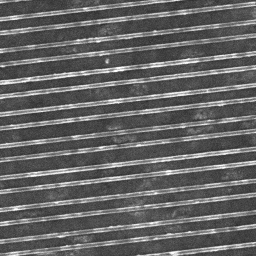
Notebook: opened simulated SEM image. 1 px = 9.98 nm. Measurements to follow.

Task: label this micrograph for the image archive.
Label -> parallel lines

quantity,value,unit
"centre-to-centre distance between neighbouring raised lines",157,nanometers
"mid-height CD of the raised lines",38.4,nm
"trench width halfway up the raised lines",107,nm